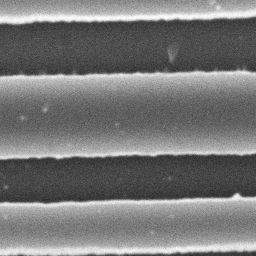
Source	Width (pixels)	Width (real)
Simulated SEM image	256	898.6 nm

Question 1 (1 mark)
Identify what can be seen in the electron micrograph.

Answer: lines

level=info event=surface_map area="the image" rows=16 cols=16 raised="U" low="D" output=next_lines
UUUUUUUUUUUUUUUU
DDDDDDDDDDDDDDDD
DDDDDDDDDDDDDDDD
DDDDDDDDDDDDDDDD
DDDDDDDDDDDDDDUD
UUUUUUUUUUUUUUUU
UUUUUUUUUUUUUUUU
UUUUUUUUUUUUUUUU
UUUUUUUUUUUUUUUU
UUUUUUUUUUUUUUUU
DDDDDDDDDDDDDDDD
DDDDDDDDDDDDDDDD
DDDDDDDDDDDUUUUU
UUUUUUUUUUUUUUUU
UUUUUUUUUUUUUUUU
UUUUUUUUUUUUUUUU